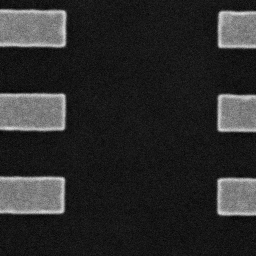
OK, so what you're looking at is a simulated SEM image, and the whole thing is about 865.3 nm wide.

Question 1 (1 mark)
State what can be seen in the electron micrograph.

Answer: wiring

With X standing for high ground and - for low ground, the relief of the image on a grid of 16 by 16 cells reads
----------------
XXXX----------XX
XXXX----------XX
----------------
----------------
----------------
XXXX----------XX
XXXX----------XX
----------------
----------------
----------------
XXXX----------XX
XXXX----------XX
----------------
----------------
----------------